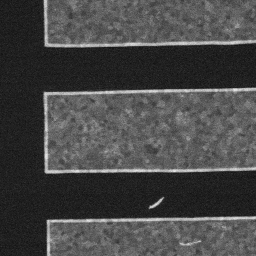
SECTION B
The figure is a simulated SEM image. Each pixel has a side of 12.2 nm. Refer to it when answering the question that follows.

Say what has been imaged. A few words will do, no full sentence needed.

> one or a few lines or trenches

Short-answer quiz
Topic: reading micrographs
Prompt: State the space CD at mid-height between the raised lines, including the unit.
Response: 584 nm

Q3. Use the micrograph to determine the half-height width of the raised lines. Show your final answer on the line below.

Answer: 972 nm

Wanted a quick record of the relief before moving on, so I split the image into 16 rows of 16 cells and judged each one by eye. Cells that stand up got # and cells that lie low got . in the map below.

...#############
...#############
...#############
................
................
................
...#############
...#############
...#############
...#############
...#############
................
................
................
...#############
...#############